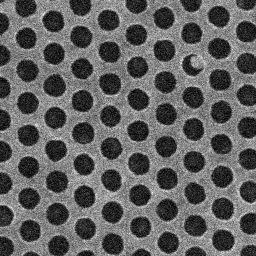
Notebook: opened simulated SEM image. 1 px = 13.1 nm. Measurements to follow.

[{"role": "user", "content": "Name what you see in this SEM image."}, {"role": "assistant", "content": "a regular array of holes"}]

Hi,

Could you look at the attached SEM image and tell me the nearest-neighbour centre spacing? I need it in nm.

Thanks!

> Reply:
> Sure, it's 413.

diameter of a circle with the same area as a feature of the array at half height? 0.301 microns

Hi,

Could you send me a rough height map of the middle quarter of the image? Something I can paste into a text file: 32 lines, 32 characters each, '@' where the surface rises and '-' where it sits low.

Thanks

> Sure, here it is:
@@-----@@@@@@@@------@@@@@@@@---
@@------@@@@@@@@-----@@@@@@@@@--
@@-----@@@---@@@-----@@----@@@@-
@@@---@@@-----@@@--@@@@-----@@@@
@@@@@@@@------@@@@@@@@------@@@@
-@@@@@@@@-----@@@@@@@@@-----@@@-
-@@@-@@@@-----@@@---@@@-----@@--
@@-----@@@---@@@-----@@@@-@@@@--
@@-----@@@@@@@@@-----@@@@@@@@---
@@------@@@@@@@@------@@@@@@@@--
@@-----@@@---@@@-----@@----@@@@-
@@@---@@@-----@@@---@@@-----@@@@
-@@@@@@@@-----@@@@@@@@@-----@@@@
-@@@@@@@@-----@@@@@@@@@-----@@@-
-@@@--@@@-----@@@---@@@-----@@--
@@-----@@@---@@@-----@@@@@@@@@--
@@------@@@@@@@@-----@@@@@@@@@--
@@------@@@@@@@@-----@@@@@@@@@--
@@------@@---@@@-----@@@---@@@@-
@@@----@@-----@@@@-@@@@-----@@@@
-@@@@@@@@------@@@@@@@------@@@@
-@@@@@@@@------@@@@@@@@-----@@@@
-@@@--@@@-----@@@---@@@-----@@--
@@@----@@@---@@@-----@@@@-@@@@--
@@------@@@@@@@@------@@@@@@@@--
@@------@@@@@@@@------@@@@@@@@--
@@@-----@@@--@@@-----@@@----@@@-
@@@@---@@-----@@@----@@-----@@@@
-@@@@@@@@------@@@@@@@@-----@@@@
-@@@@@@@@------@@@@@@@@------@@@
-@@@--@@@@----@@@---@@@-----@@--
@@@----@@@@---@@-----@@@@--@@@--